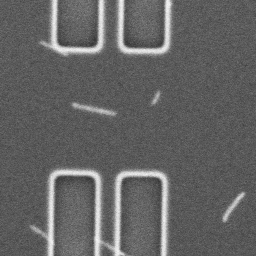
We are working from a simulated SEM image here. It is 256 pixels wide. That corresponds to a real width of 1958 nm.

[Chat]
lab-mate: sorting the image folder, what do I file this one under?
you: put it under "groups of lines, slits or small figures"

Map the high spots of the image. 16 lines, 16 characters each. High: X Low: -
XXX---XX--XXXXXX
XXX---XX--XXXXXX
XXX---XX--XXXXXX
XXXXXXXXXXXXXXXX
XXXXXXXXXXXXXXXX
XXXXXXXXXXXXXXXX
XXXXXXXXXXXXXXXX
XXXXXXXXXXXXXXXX
XXXXXXXXXXXXXXXX
XXXXXXXXXXXXXXXX
XXXXXXXXXXXXXXXX
XXX---X---XXXXXX
XXX---X---XXXXXX
XXX---X---XXXXXX
XXX---X---XXXXXX
XXX---X---XXXXXX